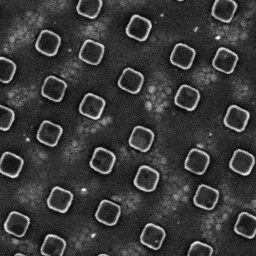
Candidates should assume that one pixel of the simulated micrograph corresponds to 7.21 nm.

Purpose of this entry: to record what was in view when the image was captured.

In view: a regular array of raised bodies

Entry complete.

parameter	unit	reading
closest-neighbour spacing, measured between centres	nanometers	314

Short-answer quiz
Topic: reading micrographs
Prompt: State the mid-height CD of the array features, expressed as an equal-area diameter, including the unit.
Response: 168 nanometers